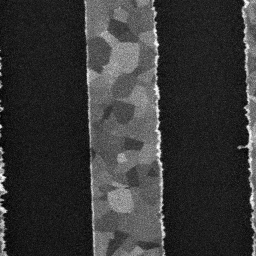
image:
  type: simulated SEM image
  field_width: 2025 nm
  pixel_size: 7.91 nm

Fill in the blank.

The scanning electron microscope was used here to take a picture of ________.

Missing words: one or a few lines or trenches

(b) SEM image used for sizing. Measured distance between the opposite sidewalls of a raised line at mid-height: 0.552 µm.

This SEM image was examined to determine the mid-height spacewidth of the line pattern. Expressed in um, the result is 0.705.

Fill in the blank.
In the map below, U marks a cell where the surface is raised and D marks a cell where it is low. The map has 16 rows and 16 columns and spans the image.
DDDDDUUUUUDDDDDU
DDDDDUUUUUDDDDDU
DDDDDUUUUUDDDDDU
DDDDDUUUUUDDDDDU
DDDDDUUUUUDDDDDU
DDDDDDUUUUDDDDDU
DDDDDDUUUUDDDDDU
DDDDDDUUUUDDDDDD
DDDDDDUUUUDDDDDD
DDDDDDUUUUDDDDDD
DDDDDDUUUUDDDDDD
DDDDDDUUUUDDDDDD
DDDDDDUUUUDDDDDD
DDDDDDUUUUDDDDDD
DDDDDDUUUUDDDDDD
DDDDDDUUUUDDDDDD